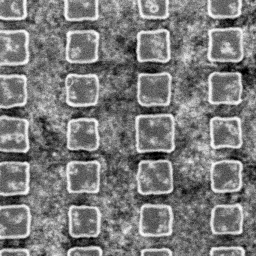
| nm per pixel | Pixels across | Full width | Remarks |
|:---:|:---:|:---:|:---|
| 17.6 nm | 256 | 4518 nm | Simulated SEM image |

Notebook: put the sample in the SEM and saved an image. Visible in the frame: a regular array of raised bodies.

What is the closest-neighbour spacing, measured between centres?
0.765 micrometres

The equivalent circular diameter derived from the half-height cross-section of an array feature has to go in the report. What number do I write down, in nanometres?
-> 603